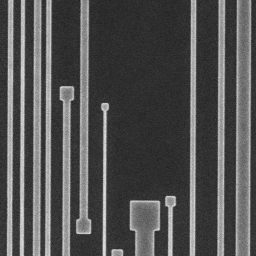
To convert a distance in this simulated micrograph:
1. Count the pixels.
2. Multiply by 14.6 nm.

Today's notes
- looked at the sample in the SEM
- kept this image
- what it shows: groups of lines, slits or small figures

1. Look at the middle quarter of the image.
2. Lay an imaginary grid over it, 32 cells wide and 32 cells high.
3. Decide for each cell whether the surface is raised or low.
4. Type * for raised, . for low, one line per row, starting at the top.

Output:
....**..........................
....**..........................
....**..........................
....**..........................
....**..........................
....**..........................
**..**..........................
**..**..........................
**..**..........................
**..**..........................
*...**...**.....................
*...**....*.....................
*...**..........................
*...**..........................
*...**..........................
*...**..........................
*...**..........................
*...**..........................
*...**..........................
*...**..........................
*...**..........................
*...**..........................
*...**..........................
*...**..........................
*...**..........................
*...**..........................
*...**..........................
*...**..........................
*...**..........................
*...**..........................
*...**..........................
*...**..........................